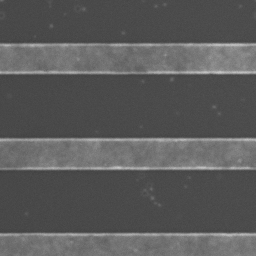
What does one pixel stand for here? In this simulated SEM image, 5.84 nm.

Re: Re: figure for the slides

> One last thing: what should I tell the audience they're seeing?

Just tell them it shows one or a few lines or trenches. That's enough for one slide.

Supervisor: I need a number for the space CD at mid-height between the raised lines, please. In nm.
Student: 381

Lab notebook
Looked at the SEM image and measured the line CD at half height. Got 168 nanometers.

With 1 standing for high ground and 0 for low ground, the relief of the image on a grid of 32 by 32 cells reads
00000000000000000000000000000000
00000000000000000000000000000000
00000000000000000000000000000000
00000000000000000000000000000000
00000000000000000000000000000000
00000000000000000000000000000000
11111111111111111111111111111111
11111111111111111111111111111111
11111111111111111111111111111111
00000000000000000000000000000000
00000000000000000000000000000000
00000000000000000000000000000000
00000000000000000000000000000000
00000000000000000000000000000000
00000000000000000000000000000000
00000000000000000000000000000000
00000000000000000000000000000000
00001111110111011111110101110000
11111111111111111111111111111111
11111111111111111111111111111111
11111111111111111111111111111111
00000000000000000000000000000000
00000000000000000000000000000000
00000000000000000000000000000000
00000000000000000000000000000000
00000000000000000000000000000000
00000000000000000000000000000000
00000000000000000000000000000000
00000000000000000000000000000000
11111111111111111111111111111111
11111111111111111111111111111111
11111111111111111111111111111111